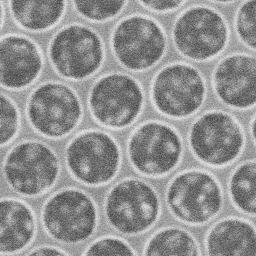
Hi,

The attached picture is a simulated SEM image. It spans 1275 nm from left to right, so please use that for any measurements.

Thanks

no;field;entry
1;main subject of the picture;a regular array of holes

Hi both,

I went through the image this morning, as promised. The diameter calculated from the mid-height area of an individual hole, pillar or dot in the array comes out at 268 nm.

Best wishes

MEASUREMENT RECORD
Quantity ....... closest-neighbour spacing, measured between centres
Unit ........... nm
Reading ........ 307